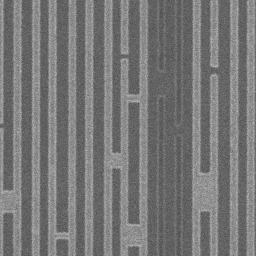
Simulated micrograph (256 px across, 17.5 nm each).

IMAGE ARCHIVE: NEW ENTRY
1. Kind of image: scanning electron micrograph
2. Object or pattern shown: parallel lines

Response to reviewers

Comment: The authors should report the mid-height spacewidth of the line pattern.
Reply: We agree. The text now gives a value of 204 nm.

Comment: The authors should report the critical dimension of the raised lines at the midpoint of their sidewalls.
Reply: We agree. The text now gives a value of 0.118 microns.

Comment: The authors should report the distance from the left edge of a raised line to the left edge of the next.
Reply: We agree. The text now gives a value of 315 nm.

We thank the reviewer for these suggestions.